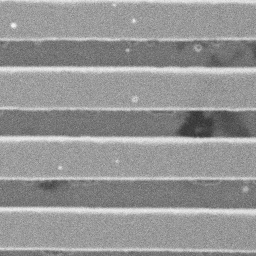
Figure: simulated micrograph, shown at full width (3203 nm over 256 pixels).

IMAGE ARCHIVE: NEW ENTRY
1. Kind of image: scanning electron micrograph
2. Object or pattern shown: lines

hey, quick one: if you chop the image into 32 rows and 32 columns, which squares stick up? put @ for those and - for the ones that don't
@@@@@@@@@@@@@@@@@@@@@@@@@@@@@@@@
@@@@@@@@@@@@@@@@@@@@@@@@@@@@@@@@
@@@@@@@@@@@@@@@@@@@@@@@@@@@@@@@@
@@@@@@@@@@@@@@@@@@@@@@@@@@@@@@@@
@@@@@@@@@@@@@@@@@@@@@@@@@@@@@@@@
--------------------------------
--------------------------------
--------------------------------
@@@@@@@@@@----@@@---------------
@@@@@@@@@@@@@@@@@@@@@@@@@@@@@@@@
@@@@@@@@@@@@@@@@@@@@@@@@@@@@@@@@
@@@@@@@@@@@@@@@@@@@@@@@@@@@@@@@@
@@@@@@@@@@@@@@@@@@@@@@@@@@@@@@@@
@@@@@@@@@@@@@@@@@@@@@@@@@@@@@@@@
--------------------------------
--------------------------------
--------------------------------
@@@@@@@@@@@@@@@@@@@@@@@@@@@@@@@@
@@@@@@@@@@@@@@@@@@@@@@@@@@@@@@@@
@@@@@@@@@@@@@@@@@@@@@@@@@@@@@@@@
@@@@@@@@@@@@@@@@@@@@@@@@@@@@@@@@
@@@@@@@@@@@@@@@@@@@@@@@@@@@@@@@@
--------------------------------
--------------------------------
--------------------------------
--------------------------------
@@@@@@@@@@@@@@@@@@@@@@@@@@@@@@@@
@@@@@@@@@@@@@@@@@@@@@@@@@@@@@@@@
@@@@@@@@@@@@@@@@@@@@@@@@@@@@@@@@
@@@@@@@@@@@@@@@@@@@@@@@@@@@@@@@@
@@@@@@@@@@@@@@@@@@@@@@@@@@@@@@@@
--------------------------------